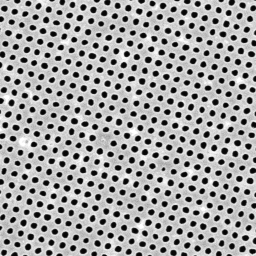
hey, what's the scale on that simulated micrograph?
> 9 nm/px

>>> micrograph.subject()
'a regular array of holes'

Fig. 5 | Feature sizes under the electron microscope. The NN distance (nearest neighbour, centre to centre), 0.0959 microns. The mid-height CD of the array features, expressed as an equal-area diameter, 57.4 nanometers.